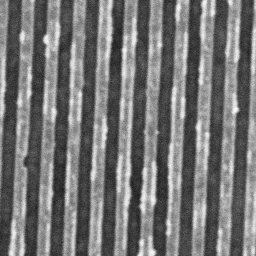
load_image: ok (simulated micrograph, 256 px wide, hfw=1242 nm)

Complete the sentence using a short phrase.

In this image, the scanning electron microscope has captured parallel lines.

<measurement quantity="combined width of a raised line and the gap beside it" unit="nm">125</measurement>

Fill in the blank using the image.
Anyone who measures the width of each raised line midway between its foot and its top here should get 55.1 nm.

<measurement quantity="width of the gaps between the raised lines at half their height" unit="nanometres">69.1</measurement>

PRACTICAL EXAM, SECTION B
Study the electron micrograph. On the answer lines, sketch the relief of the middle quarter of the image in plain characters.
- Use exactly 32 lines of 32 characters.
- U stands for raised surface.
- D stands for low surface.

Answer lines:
DDUUDDDDUUUDDDDUUDDDDUUUDDDDUUUD
DDUUUDDDUUUDDDDUUDDDDUUUDDDDUUDD
DDUUUDDDUUUDDDDUUDDDDUUUDDDDUUDD
DDUUUDDDUUUDDDDUUDDDDUUUDDDDUUDD
DDUUUDDDUUUDDDDUUDDDDUUUDDDUUUDD
DDUUDDDDUUUDDDDUUDDDDUUUDDDUUUDD
DDUUDDDDUUUDDDDUUDDDDUUUDDDUUUDD
DDUUDDDDUUUDDDDUUDDDDUUUDDDUUUDD
DDUUDDDDUUUDDDDUUDDDDUUDDDDUUUDD
DUUUDDDDUUDDDDUUUDDDDUUDDDDUUUDD
DDUUDDDDUUDDDDUUUDDDDUUDDDDUUUDD
DDUUDDDDUUDDDDUUUDDDDUUDDDDUUUDD
DUUUDDDDUUDDDDUUUDDDDUUDDDDUUUDD
DUUUDDDDUUUDDDUUUDDDDUUDDDDUUUDD
DUUUDDDDUUDDDDUUUDDDDUUDDDDUUUDD
DUUUDDDDUUUDDDUUUDDDDUUDDDDUUUDD
DUUUDDDDUUUDDDUUUDDDUUUDDDDUUUDD
DUUUDDDDUUUDDDUUUDDDUUUDDDDUUUDD
DUUUDDDDUUUDDDUUDDDDUUUDDDDUUUDD
DUUUDDDDUUDDDDUUDDDDUUUDDDDUUDDD
DUUUDDDDUUDDDDUUDDDDUUUDDDUUUDDD
DUUUDDDDUUDDDDUUDDDDUUUDDDDUUDDD
DUUDDDDUUUDDDDUUDDDDUUUDDDUUUDDD
DUUDDDDUUUDDDDUUDDDDUUUDDDUUUDDD
DUUDDDDUUUDDDDUUDDDDUUUDDDUUUDDD
DUUDDDDUUUDDDDUUUDDDUUUDDDUUUDDD
DUUDDDDUUUDDDUUUUDDDUUUDDDUUUDDD
DUUDDDDUUUDDDUUUUDDDUUUDDDUUUDDD
DUUDDDDUUUDDDUUUDDDDUUUDDDUUUDDD
DUUDDDDUUUDDDUUUDDDDUUUDDDUUUDDD
UUUDDDDUUUDDDUUUDDDDUUUDDDUUUDDD
UUUDDDDUUUDDDUUUUDDUUUUDDDUUUDDD